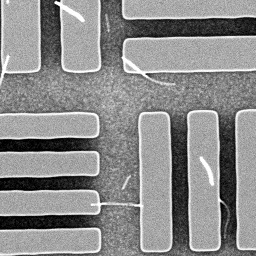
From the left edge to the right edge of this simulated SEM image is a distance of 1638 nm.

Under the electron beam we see groups of lines, slits or small figures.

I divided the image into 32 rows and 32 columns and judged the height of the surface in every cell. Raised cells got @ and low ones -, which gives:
@@@@@--@@@@@---@@@@@@@@@@@@@@@@@
@@@@@---@@@@---@@@@@@@@@@@@@@@@@
@@@@@---@@@@--------------------
@@@@@---@@@@--------------------
@@@@@---@@@@-------------------@
@@@@@---@@@@---@@@@@@@@@@@@@@@@@
@@@@@---@@@@---@@@@@@@@@@@@@@@@@
@@@@@---@@@@@--@@@@@@@@@@@@@@@@@
@@@@@---@@@@----@@@@@@@@@@@@@@@@
--------------------------------
--------------------------------
--------------------------------
--------------------------------
--------------------------------
@@@@@@@@@@@@------@@@---@@@---@@
@@@@@@@@@@@@-----@@@@---@@@---@@
@@@@@@@@@@@@-----@@@@---@@@---@@
-----------------@@@@---@@@---@@
------------------@@@---@@@---@@
@@@@@@@@@@@@------@@@---@@@---@@
@@@@@@@@@@@@------@@@---@@@---@@
@@@@@@@@@@@@------@@@---@@@---@@
------------------@@@---@@@---@@
------------------@@@---@@@---@@
@@@@@@@@@@@@------@@@---@@@---@@
@@@@@@@@@@@@@-----@@@---@@@---@@
@@@@@@@@@@@@------@@@---@@@---@@
------------------@@@---@@@---@@
------------------@@@---@@@---@@
@@@@@@@@@@@@@-----@@@---@@@---@@
@@@@@@@@@@@@@-----@@@---@@@---@@
@@@@@@@@@@@---------------------